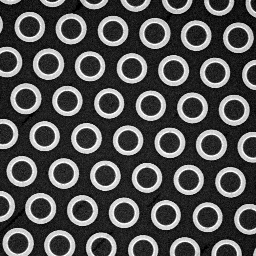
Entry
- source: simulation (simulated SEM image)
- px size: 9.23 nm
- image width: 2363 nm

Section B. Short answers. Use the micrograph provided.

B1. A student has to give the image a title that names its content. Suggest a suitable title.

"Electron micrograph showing an array of small figures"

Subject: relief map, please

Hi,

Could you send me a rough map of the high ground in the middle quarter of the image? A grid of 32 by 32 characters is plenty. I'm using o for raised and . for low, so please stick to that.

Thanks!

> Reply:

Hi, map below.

...ooooooo...oooooooo...ooooooo.
...ooooooo...oooooooo...ooooooo.
...ooooooo...oooooooo...ooooooo.
....ooooo.....oooooo....ooooooo.
...............oooo......ooooo..
................................
ooo.......ooo...................
oooo....oooooo.....ooooo.......o
ooooo...ooooooo...ooooooo....ooo
ooooo...ooooooo...ooooooo....ooo
oooo....ooooooo...ooooooo...oooo
oooo....ooooooo...ooooooo...oooo
ooo......ooooo.....oooooo....ooo
..........oo.......ooooo.....ooo
...............................o
...ooooo.......o................
..ooooooo....oooooo.....oooo....
..ooooooo....oooooo....ooooooo..
..ooooooo...oooooooo...ooooooo..
..ooooooo...oooooooo...ooooooo..
..ooooooo....ooooooo...ooooooo..
...ooooo.....oooooo....ooooooo..
..............oooo......ooooo...
................................
oo.......ooo....................
ooo....oooooo......oooo.......oo
oooo...ooooooo....oooooo....oooo
oooo...ooooooo...ooooooo....oooo
oooo...ooooooo...ooooooo...ooooo
ooo....ooooooo...ooooooo....oooo
oo......ooooo.....oooooo....oooo
.........oo........oooo.....oooo